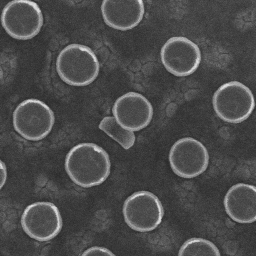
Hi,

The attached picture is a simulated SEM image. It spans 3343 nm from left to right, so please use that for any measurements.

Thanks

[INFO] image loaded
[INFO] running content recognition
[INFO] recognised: a regular array of raised bodies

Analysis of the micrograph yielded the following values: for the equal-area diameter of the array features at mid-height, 505 nanometres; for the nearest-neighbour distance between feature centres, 920 nm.